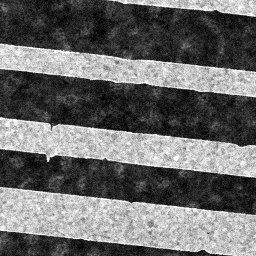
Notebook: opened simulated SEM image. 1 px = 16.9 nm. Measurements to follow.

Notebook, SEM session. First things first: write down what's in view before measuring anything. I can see one or a few lines or trenches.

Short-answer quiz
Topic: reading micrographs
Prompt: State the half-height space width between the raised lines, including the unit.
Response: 0.831 um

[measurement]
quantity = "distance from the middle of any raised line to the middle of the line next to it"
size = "75.8 px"